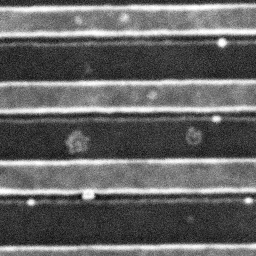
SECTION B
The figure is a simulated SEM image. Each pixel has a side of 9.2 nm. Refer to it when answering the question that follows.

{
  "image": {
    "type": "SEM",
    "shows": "lines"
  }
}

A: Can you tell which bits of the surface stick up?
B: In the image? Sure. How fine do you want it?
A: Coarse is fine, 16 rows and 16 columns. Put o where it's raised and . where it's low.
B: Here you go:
...ooooooooooooo
oooooooooooooooo
................
................
................
oooooooooooooooo
oooooooooooooooo
................
................
................
oooooooooooooooo
oooooooooooooooo
................
................
................
oooooooooooooooo